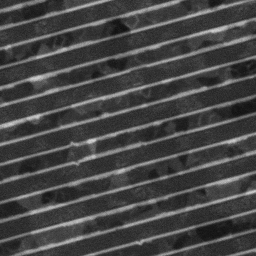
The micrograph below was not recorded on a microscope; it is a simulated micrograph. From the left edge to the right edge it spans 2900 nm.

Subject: parallel lines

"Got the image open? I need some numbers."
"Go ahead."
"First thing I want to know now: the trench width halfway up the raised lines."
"211 nanometres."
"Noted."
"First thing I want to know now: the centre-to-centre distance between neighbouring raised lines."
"421 nanometres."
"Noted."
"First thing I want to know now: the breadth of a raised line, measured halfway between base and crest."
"0.211 microns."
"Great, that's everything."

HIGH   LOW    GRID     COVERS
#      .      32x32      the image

...#########.........########...
########.........#########......
####.........#########.........#
#.........########..........####
......#########.........########
..#########.........#########...
#######.........#########.......
####.........########.........##
.........########..........#####
.....#########.........#########
..########.........#########....
######.........#########........
###.........#########.........##
........#########.........######
....##########.........########.
.#########.........########.....
######.........#########........
##.........#########.........###
........########..........######
....########..........#########.
#########.........#########.....
#####.........#########.........
#.........#########.........####
.......#########.........#######
...#########.........#########..
########.........#########......
#####.........########.........#
#.........#########.........####
......#########.........########
...########.........#########...
########........#########.......
####.........#########.........#